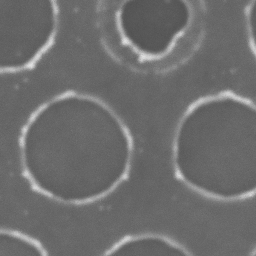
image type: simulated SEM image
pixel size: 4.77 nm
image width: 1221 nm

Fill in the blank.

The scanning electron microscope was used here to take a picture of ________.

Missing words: holes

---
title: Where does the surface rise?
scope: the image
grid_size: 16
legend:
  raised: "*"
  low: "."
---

...*****....****
...*****....****
...*****...*****
..**************
****************
****************
***...*******..*
**.....*****....
**......***.....
**......***.....
**......***.....
**.....*****....
****.***********
****************
****************
..*****....*****